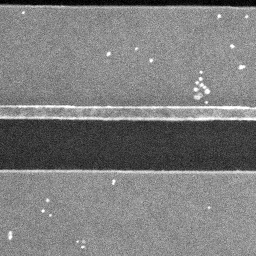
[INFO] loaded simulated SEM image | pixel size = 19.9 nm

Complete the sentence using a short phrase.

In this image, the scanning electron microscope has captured lines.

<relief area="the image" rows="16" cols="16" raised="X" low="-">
XXXXXXXXXXXXXXX-
XXXXXXXXXXXXXXXX
XXXXXXXXXXXXXXXX
XXXXXXXXXXXXXXXX
XXXXXXXXXXXXXXXX
XXXXXXXXXXXXXXXX
XXXXXXXXXXXXXXXX
----------------
----------------
----------------
----------------
XXXXXXXXXXXXXXXX
XXXXXXXXXXXXXXXX
XXXXXXXXXXXXXXXX
XXXXXXXXXXXXXXXX
XXXXXXXXXXXXXXXX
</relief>